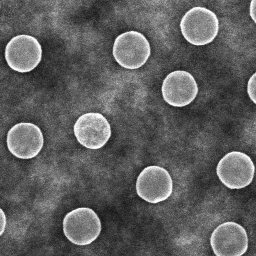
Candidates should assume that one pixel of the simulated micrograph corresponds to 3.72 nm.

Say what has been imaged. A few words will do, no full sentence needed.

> a regular array of raised bodies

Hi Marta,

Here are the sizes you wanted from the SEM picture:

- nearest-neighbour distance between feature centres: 253 nm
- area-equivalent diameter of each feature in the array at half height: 134 nm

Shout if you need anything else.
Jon